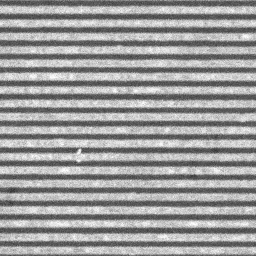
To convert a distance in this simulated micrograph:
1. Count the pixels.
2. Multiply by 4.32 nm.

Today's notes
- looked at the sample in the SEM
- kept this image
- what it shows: parallel lines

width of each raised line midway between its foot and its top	6.5	px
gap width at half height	0.0324	micrometres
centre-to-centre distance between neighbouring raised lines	57.7	nm